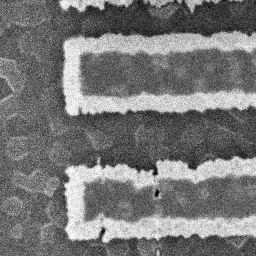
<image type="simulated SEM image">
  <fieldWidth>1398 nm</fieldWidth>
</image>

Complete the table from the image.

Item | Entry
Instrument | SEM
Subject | one or a few lines or trenches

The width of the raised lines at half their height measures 341 nm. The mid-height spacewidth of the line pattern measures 351 nm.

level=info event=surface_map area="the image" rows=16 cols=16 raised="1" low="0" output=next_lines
0000000000000000
0000000000000000
0000000000100111
0000111111111111
0000111111111111
0000111111111111
0000011110111000
0000000000000000
0000000000000000
0000000000000000
0000000000000111
0000011111111111
0000011111111111
0000011111111111
0000000000000000
0000000000000000